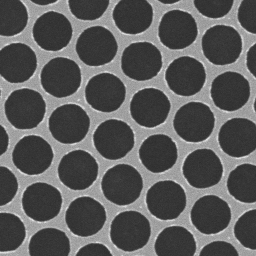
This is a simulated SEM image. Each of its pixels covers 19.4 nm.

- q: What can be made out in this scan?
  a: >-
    a regular array of holes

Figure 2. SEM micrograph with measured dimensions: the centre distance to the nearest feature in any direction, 46.6 pixels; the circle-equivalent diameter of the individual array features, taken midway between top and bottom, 0.785 microns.